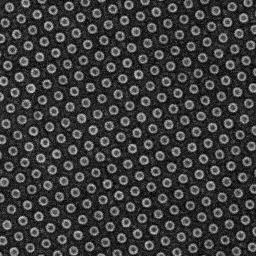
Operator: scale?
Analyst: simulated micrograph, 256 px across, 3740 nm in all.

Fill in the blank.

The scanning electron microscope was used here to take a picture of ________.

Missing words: a regular array of raised bodies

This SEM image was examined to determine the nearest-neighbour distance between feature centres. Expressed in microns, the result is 0.235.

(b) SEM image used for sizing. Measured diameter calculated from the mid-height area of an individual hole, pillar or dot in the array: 119 nanometers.